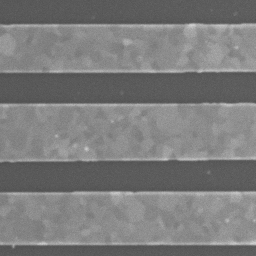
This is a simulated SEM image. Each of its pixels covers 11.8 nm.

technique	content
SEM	lines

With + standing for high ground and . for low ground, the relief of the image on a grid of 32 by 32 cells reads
................................
................................
................................
++++++++++++++++++++++++++++++++
++++++++++++++++++++++++++++++++
++++++++++++++++++++++++++++++++
++++++++++++++++++++++++++++++++
++++++++++++++++++++++++++++++++
++++++++++++++++++++++++++++++++
................................
................................
................................
................................
++++++++++++++++++++++++++++++++
++++++++++++++++++++++++++++++++
++++++++++++++++++++++++++++++++
++++++++++++++++++++++++++++++++
++++++++++++++++++++++++++++++++
++++++++++++++++++++++++++++++++
++++++++++++++++++++++++++++++++
................................
................................
................................
................................
++++++++++++++++++++++++++++++++
++++++++++++++++++++++++++++++++
++++++++++++++++++++++++++++++++
++++++++++++++++++++++++++++++++
++++++++++++++++++++++++++++++++
++++++++++++++++++++++++++++++++
++++++++++++++++++++++++++++++++
................................